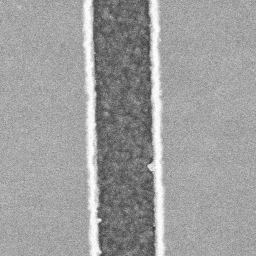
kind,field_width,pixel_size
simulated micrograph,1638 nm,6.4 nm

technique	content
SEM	one or a few lines or trenches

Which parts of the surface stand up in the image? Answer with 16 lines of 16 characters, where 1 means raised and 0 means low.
1111100000111111
1111110000111111
1111110000111111
1111110000111111
1111110000111111
1111110000111111
1111110000111111
1111110000111111
1111110000111111
1111110000111111
1111110000111111
1111110000111111
1111110000111111
1111110000111111
1111110000111111
1111110000111111